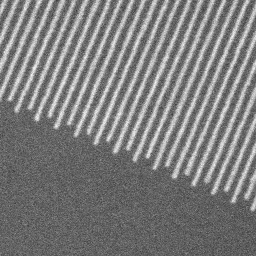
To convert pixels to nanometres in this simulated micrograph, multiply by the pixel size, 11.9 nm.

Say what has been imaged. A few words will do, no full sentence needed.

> parallel lines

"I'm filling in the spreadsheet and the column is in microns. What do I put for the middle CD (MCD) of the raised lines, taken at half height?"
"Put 0.0343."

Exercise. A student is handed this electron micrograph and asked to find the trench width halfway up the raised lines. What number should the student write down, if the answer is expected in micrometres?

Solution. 0.0907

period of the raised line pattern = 127 nm